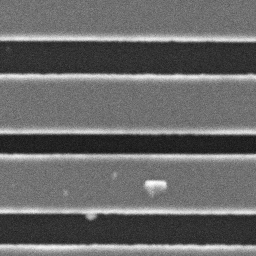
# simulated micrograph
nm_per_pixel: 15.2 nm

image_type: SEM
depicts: lines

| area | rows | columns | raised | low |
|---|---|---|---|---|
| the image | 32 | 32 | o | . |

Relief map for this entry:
oooooooooooooooooooooooooooooooo
oooooooooooooooooooooooooooooooo
oooooooooooooooooooooooooooooooo
oooooooooooooooooooooooooooooooo
oooooooooooooooooooooooooooooooo
................................
................................
................................
................................
oooooooooooooooooooooooooooooooo
oooooooooooooooooooooooooooooooo
oooooooooooooooooooooooooooooooo
oooooooooooooooooooooooooooooooo
oooooooooooooooooooooooooooooooo
oooooooooooooooooooooooooooooooo
oooooooooooooooooooooooooooooooo
oooooooooooooooooooooooooooooooo
................................
................................
oooooooooooooooooooooooooooooooo
oooooooooooooooooooooooooooooooo
oooooooooooooooooooooooooooooooo
oooooooooooooooooooooooooooooooo
oooooooooooooooooooooooooooooooo
oooooooooooooooooooooooooooooooo
oooooooooooooooooooooooooooooooo
oooooooooooooooooooooooooooooooo
................................
................................
................................
................................
oooooooooooooooooooooooooooooooo